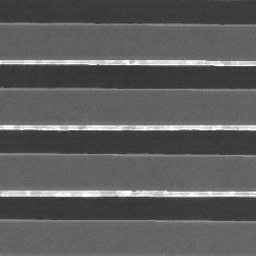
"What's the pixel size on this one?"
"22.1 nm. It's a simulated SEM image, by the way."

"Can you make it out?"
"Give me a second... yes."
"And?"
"lines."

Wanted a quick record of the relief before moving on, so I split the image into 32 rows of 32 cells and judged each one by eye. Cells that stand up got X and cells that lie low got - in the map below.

--------------------------------
--------------------------------
--------------------------------
XXXXXXXXXXXXXXXXXXXXXXXXXXXXXXXX
XXXXXXXXXXXXXXXXXXXXXXXXXXXXXXXX
XXXXXXXXXXXXXXXXXXXXXXXXXXXXXXXX
XXXXXXXXXXXXXXXXXXXXXXXXXXXXXXXX
XXXXXXXXXXXXXXXXXXXXXXXXXXXXXXXX
--------------------------------
--------------------------------
--------------------------------
XXXXXXXXXXXXXXXXXXXXXXXXXXXXXXXX
XXXXXXXXXXXXXXXXXXXXXXXXXXXXXXXX
XXXXXXXXXXXXXXXXXXXXXXXXXXXXXXXX
XXXXXXXXXXXXXXXXXXXXXXXXXXXXXXXX
XXXXXXXXXXXXXXXXXXXXXXXXXXXXXXXX
--------------------------------
--------------------------------
--------------------------------
XXXXXXXXXXXXXXXXXXXXXXXXXXXXXXX-
XXXXXXXXXXXXXXXXXXXXXXXXXXXXXXXX
XXXXXXXXXXXXXXXXXXXXXXXXXXXXXXXX
XXXXXXXXXXXXXXXXXXXXXXXXXXXXXXXX
XXXXXXXXXXXXXXXXXXXXXXXXXXXXXXXX
--------------------------------
--------------------------------
--------------------------------
--------------------------------
XXXXXXXXXXXXXXXXXXXXXXXXXXXXXXXX
XXXXXXXXXXXXXXXXXXXXXXXXXXXXXXXX
XXXXXXXXXXXXXXXXXXXXXXXXXXXXXXXX
XXXXXXXXXXXXXXXXXXXXXXXXXXXXXXXX